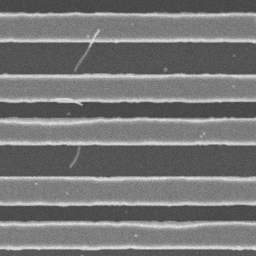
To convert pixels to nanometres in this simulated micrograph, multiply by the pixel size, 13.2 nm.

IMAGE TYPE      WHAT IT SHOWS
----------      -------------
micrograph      lines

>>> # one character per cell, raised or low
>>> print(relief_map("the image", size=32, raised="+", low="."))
................................
................................
++++++++++++++++++++++++++++++++
++++++++++++++++++++++++++++++++
++++++++++++++++++++++++++++++++
................................
................................
................................
................................
++++++++++++++++++++++++++++++++
++++++++++++++++++++++++++++++++
++++++++++++++++++++++++++++++++
++++++++++++++++++++++++++++++++
................................
................................
++++++++++++++++++++++++++++++++
++++++++++++++++++++++++++++++++
++++++++++++++++++++++++++++++++
................................
................................
................................
................................
++++++++++++++++++++++++++++++++
++++++++++++++++++++++++++++++++
++++++++++++++++++++++++++++++++
++++++++++++++++++++++++++++++++
................................
................................
++++++++++++++++++++++++++++++++
++++++++++++++++++++++++++++++++
++++++++++++++++++++++++++++++++
................................